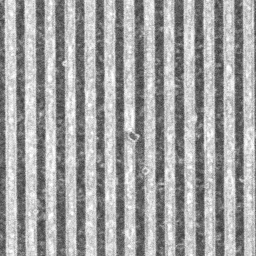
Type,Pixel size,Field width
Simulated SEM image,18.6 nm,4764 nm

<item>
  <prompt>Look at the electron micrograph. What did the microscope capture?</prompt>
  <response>parallel lines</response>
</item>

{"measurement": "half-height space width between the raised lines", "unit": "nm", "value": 160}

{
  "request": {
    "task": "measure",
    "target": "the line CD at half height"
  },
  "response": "0.214 µm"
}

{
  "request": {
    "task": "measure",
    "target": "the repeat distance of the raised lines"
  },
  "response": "369 nm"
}